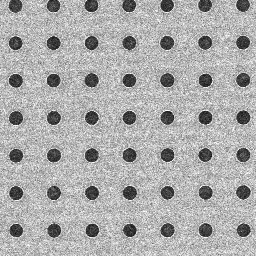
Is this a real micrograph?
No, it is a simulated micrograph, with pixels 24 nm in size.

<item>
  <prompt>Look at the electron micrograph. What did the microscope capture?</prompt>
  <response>a regular array of holes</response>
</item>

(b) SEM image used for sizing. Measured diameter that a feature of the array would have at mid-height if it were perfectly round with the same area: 341 nanometers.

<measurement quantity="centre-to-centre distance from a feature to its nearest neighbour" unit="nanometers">897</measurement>